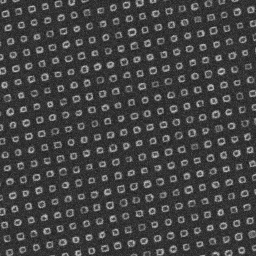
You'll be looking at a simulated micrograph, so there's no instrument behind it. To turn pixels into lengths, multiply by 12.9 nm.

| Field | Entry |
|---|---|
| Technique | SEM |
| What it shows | a regular array of raised bodies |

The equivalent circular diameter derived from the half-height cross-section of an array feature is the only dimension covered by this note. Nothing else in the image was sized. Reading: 85.2 nm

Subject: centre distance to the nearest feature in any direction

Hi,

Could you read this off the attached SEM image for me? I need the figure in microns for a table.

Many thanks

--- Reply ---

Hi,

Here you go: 0.171